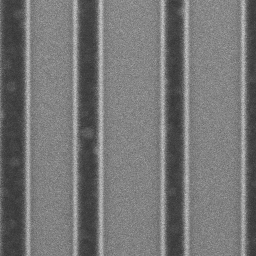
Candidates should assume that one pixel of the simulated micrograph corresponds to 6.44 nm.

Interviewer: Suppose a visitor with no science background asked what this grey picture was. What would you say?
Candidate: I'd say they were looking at one or a few lines or trenches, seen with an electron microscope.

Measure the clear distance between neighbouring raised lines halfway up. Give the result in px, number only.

55.8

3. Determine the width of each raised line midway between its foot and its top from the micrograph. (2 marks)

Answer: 165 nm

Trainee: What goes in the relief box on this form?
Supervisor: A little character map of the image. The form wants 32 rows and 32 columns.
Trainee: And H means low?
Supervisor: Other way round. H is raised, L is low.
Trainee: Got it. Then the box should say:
HHHHLLLLLHHHHLLLLLLLHHHLLLLLLLHH
HHHHLLLLLHHHHLLLLLLLHHHLLLLLLLHH
HHHHLLLLLHHHHLLLLLLLHHHLLLLLLLHH
HHHHLLLLLHHHHLLLLLLLHHHLLLLLLLHH
HHHHLLLLLHHHHLLLLLLLHHHLLLLLLLHH
HHHHLLLLLHHHHLLLLLLLHHHLLLLLLLHH
HHHHLLLLLHHHHLLLLLLLHHHLLLLLLLHH
HHHHLLLLLHHHHLLLLLLLHHHLLLLLLLHH
HHHHLLLLLHHHHLLLLLLLHHHLLLLLLLHH
HHHHLLLLLHHHHLLLLLLLHHHLLLLLLLHH
HHHHLLLLLHHHHLLLLLLLHHHLLLLLLLHH
HHHHLLLLLHHHHLLLLLLLHHHLLLLLLLHH
HHHHLLLLLHHHHLLLLLLLHHHLLLLLLLHH
HHHHLLLLLHHHHLLLLLLLHHHLLLLLLLHH
HHHHLLLLLHHHHLLLLLLLHHHLLLLLLLHH
HHHHLLLLLHHHHLLLLLLLHHHLLLLLLLHH
HHHHLLLLLHHHHLLLLLLLHHHLLLLLLLHH
HHHHLLLLLHHHHLLLLLLLHHHLLLLLLLHH
HHHHLLLLLHHHHLLLLLLLHHHLLLLLLLHH
HHHHLLLLLHHHHLLLLLLLHHHLLLLLLLHH
HHHHLLLLLHHHHLLLLLLLHHHLLLLLLLHH
HHHHLLLLLHHHHLLLLLLLHHHLLLLLLLHH
HHHHLLLLLHHHHLLLLLLLHHHLLLLLLLHH
HHHHLLLLLHHHHLLLLLLLHHHLLLLLLLHH
HHHHLLLLLHHHHLLLLLLLHHHLLLLLLLHH
HHHHLLLLLHHHHLLLLLLLHHHLLLLLLLHH
HHHHLLLLLHHHHLLLLLLLHHHLLLLLLLHH
HHHHLLLLLHHHHLLLLLLLHHHLLLLLLLHH
HHHHLLLLLHHHHLLLLLLLHHHLLLLLLLHH
HHHHLLLLLHHHHLLLLLLLHHHLLLLLLLHH
HHHHLLLLLHHHHLLLLLLLHHHLLLLLLLHH
HHHHLLLLLHHHHLLLLLLLHHHLLLLLLLHH